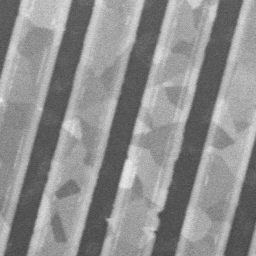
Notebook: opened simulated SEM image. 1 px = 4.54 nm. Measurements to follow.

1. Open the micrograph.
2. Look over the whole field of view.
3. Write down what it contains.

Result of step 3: one or a few lines or trenches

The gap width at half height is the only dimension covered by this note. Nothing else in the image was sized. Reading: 148 nm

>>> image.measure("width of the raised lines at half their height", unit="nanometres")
175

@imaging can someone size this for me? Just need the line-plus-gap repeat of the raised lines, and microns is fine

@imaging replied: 0.323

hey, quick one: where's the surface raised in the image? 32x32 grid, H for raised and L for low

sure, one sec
LLLHHHHHLLLLHHHHHLLLLLHHHHHLLLLH
LLLHHHHHLLLLHHHHHLLLLHHHHHHLLLLH
LLLHHHHHLLLLHHHHHLLLLHHHHHLLLLHH
LLHHHHHLLLLLHHHHHLLLLHHHHHLLLLHH
LLHHHHHLLLLHHHHHLLLLHHHHHHLLLLHH
LLHHHHHLLLLHHHHHLLLLHHHHHLLLLHHH
LLHHHHHLLLLHHHHHLLLLHHHHHLLLLHHH
LHHHHHLLLLLHHHHLLLLLHHHHHLLLLHHH
LHHHHHLLLLHHHHHLLLLHHHHHHLLLLHHH
LHHHHHLLLLHHHHHLLLLHHHHHLLLLHHHH
HHHHHHLLLLHHHHHLLLLHHHHHLLLLHHHH
HHHHHLLLLHHHHHHLLLLHHHHHLLLLHHHH
HHHHHLLLLHHHHHLLLLHHHHHLLLLLHHHH
HHHHHLLLLHHHHHLLLLHHHHHLLLLHHHHH
HHHHLLLLLHHHHHLLLLHHHHHLLLLHHHHH
HHHHLLLLHHHHHLLLLLHHHHHLLLLHHHHH
HHHHLLLLHHHHHLLLLHHHHHLLLLHHHHHH
HHHHLLLLHHHHHLLLLHHHHHLLLLHHHHHL
HHHLLLLLHHHHHLLLLHHHHHLLLLHHHHHL
HHHLLLLHHHHHLLLLLHHHHHLLLLHHHHHL
HHHLLLLHHHHHLLLLHHHHHLLLLHHHHHLL
HHHLLLLHHHHHLLLLHHHHHLLLLHHHHHLL
HHLLLLHHHHHHLLLLHHHHHLLLLHHHHHLL
HHLLLLHHHHHLLLLHHHHHLLLLLHHHHHLL
HHLLLLHHHHHLLLLHHHHHLLLLHHHHHLLL
HHLLLLHHHHHLLLLHHHHHLLLLHHHHHLLL
HLLLLHHHHHLLLLLHHHHLLLLLHHHHHLLL
HLLLLHHHHHLLLLHHHHHLLLLLHHHHHLLL
HLLLLHHHHHLLLLHHHHHLLLLHHHHHLLLL
LLLLLHHHHHLLLLHHHHHLLLLHHHHHLLLL
LLLLHHHHHLLLLLHHHHHLLLLHHHHHLLLL
LLLLHHHHHLLLLHHHHHLLLLLHHHHLLLLL